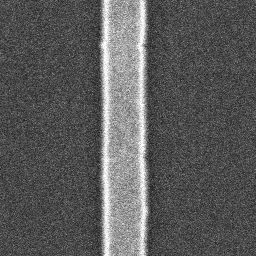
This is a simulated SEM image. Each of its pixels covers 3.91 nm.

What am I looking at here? one or a few lines or trenches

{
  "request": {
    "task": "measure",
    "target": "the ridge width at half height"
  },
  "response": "144 nm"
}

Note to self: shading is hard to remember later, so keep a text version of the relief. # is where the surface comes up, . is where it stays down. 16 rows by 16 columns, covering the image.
.......##.......
.......##.......
.......##.......
.......##.......
.......##.......
.......##.......
.......##.......
.......##.......
.......##.......
.......##.......
.......##.......
.......##.......
.......##.......
.......##.......
.......##.......
.......##.......